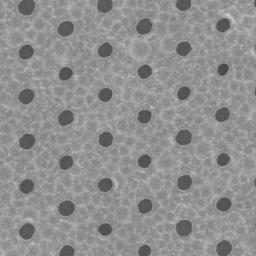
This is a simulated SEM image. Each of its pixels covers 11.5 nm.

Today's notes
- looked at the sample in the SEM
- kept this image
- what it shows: a regular array of holes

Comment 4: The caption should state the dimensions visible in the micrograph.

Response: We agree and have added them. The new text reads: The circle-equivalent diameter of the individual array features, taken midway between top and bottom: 15.3 pixels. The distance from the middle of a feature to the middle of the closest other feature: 509 nanometers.